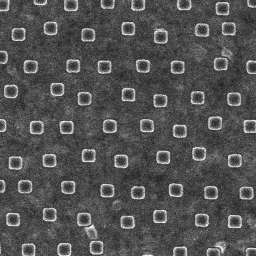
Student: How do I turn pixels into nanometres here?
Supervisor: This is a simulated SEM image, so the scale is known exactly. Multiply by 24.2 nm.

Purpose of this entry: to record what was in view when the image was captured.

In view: a regular array of raised bodies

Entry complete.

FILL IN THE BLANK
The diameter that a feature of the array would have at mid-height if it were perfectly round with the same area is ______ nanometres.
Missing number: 339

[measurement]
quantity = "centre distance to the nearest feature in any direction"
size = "746 nanometres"